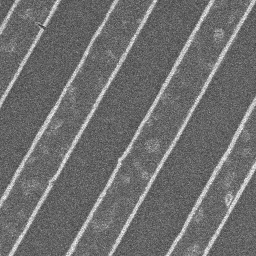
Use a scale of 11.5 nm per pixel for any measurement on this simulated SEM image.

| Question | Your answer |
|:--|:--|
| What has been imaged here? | one or a few lines or trenches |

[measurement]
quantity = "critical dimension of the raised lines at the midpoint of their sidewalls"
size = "0.408 um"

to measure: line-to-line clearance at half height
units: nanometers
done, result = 572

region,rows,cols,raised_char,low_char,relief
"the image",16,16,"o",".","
.oo....oo....ooo
ooo...ooo...ooo.
oo....oo....oo..
oo...ooo...ooo..
o....oo....oo...
o...ooo...ooo...
....oo....oo....
...oo....ooo...o
..ooo...ooo....o
..oo....ooo...oo
.ooo...ooo....oo
.oo....oo....oo.
ooo...ooo...ooo.
oo....oo....oo..
oo...ooo...ooo..
o....oo....oo...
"